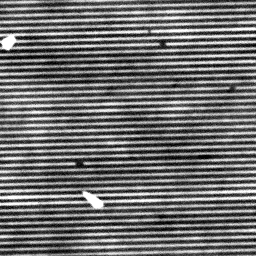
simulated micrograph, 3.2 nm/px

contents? parallel lines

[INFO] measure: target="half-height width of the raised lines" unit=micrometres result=0.0044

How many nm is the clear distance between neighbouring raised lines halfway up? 16.4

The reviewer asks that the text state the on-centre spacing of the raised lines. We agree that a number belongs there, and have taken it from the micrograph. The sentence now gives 20.8 nanometres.